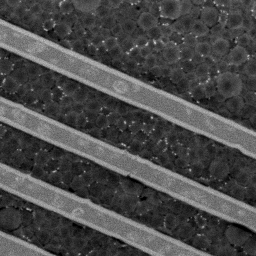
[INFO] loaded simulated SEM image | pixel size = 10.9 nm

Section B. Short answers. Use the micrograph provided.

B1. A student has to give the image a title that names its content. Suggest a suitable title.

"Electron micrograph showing one or a few lines or trenches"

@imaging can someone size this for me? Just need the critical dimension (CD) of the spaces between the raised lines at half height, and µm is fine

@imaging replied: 0.512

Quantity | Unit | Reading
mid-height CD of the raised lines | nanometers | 214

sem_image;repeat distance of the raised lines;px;66.1